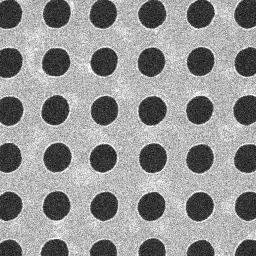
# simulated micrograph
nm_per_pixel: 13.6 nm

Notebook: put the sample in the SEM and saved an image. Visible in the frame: a regular array of holes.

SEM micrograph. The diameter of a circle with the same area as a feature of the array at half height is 397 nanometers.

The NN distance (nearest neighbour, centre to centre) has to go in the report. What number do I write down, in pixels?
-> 47.2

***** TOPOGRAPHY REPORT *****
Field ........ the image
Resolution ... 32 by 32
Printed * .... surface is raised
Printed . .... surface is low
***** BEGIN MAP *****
..****...***..****..****..****..
...**....**....**....**....**...
...**....**...***....**....**...
..****.*****.*****..****.*****.*
********************************
********************************
..****..****..****..****..****..
...**....**....**....**....**...
...**....**....**...***....**...
..****..**********.***********..
********************************
********************************
..****..****..****..****..****..
...**....**....**....**....**...
...**....**....**....**...***...
..****..****..****..****.*****.*
********************************
********************************
..****...***..****..****..****..
...**....**....**....**....**...
...**....**...***....**....**...
..****..****.*****..****..****..
********************************
********************************
..****..****..****..****..****..
...**....**....**....**....**...
...**....**....**....**....**...
.*****..****..****..****..****..
*******.************************
********************************
..****..****..****..****..****..
...**....**....**....**....**...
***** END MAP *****